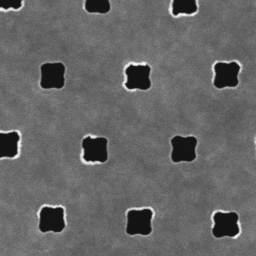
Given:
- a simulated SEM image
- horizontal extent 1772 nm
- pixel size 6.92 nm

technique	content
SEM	a regular array of holes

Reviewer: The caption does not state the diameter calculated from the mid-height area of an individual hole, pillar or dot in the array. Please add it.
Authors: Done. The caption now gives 187 nm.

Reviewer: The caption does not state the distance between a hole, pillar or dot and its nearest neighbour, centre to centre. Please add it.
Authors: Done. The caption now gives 0.588 µm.